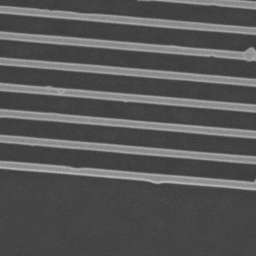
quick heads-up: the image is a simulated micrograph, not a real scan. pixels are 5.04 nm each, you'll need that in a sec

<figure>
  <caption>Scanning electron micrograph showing parallel lines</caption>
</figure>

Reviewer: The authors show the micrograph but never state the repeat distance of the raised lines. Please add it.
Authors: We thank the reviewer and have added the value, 130 nm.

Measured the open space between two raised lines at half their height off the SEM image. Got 18.9 px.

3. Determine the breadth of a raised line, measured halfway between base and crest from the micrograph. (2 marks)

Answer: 36.4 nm